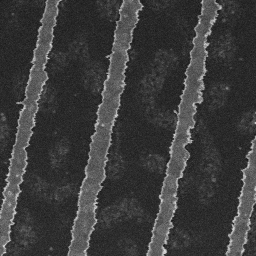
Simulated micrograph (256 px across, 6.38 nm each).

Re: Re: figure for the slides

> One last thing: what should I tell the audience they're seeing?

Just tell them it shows one or a few lines or trenches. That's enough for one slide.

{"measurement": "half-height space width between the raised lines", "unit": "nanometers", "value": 385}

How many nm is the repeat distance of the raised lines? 490